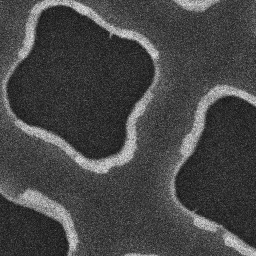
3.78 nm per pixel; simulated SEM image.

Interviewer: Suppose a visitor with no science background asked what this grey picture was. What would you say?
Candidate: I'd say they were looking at holes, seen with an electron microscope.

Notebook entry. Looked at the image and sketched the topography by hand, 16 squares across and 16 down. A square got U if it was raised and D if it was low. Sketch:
UUUDUUUUUUUUUUUU
UUDDDDUUUUUUUUUU
UUDDDDDDUUUUUUUU
UUDDDDDDDUUUUUUU
UDDDDDDDDDUUUUUU
DDDDDDDDDUUUUUUU
DDDDDDDDDUUUUDDD
UDDDDDDDUUUUUDDD
UUUDDDDDUUUUDDDD
UUUUUDDUUUUUDDDD
UUUUUUUUUUUDDDDD
UUUUUUUUUUUDDDDD
DUUUUUUUUUUDDDDD
DDDUUUUUUUUUDDDD
DDDDUUUUUUUUUUDD
DDDDUUUUUUUUUUUU